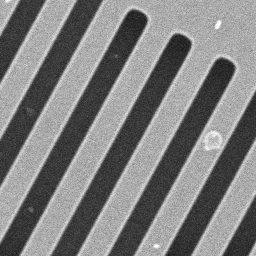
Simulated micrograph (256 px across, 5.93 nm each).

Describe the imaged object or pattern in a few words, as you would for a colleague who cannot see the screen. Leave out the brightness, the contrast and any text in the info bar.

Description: groups of lines, slits or small figures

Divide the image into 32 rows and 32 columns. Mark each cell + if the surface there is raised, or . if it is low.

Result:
++....+++....+++++++++++++++++++
++...++++...++++..++++++++++++++
+...++++....+++...++++++++++++++
....++++...++++...++++++++++++++
...++++...++++....++++.+++++++++
...++++...++++...++++...++++++++
..++++...++++...++++....++++++++
..+++....++++...++++...++++..+++
.++++...++++...++++....+++...+++
.+++....+++....++++...++++...+++
++++...++++...++++...++++....+++
+++....+++....++++...++++...++++
+++...++++...++++...++++...++++.
++...++++....+++....++++...++++.
++...++++...++++...++++...++++..
+...++++...++++....++++...++++..
....++++...++++...++++...++++...
...++++...++++....+++....++++...
...++++...++++...++++...++++...+
..++++...++++...++++....+++....+
..+++....++++...++++...++++...++
.++++...++++...++++....+++....++
.+++....+++....++++...++++...+++
++++...++++...++++...++++....+++
+++....+++....++++...++++...++++
+++...++++...++++...++++...++++.
++...++++....+++....++++...++++.
++...++++...++++...++++...++++..
+...++++...++++....+++....++++..
....++++...++++...++++...++++...
...++++...++++....+++....++++...
...++++...++++...++++...++++...+